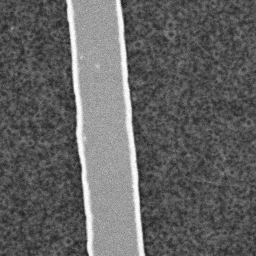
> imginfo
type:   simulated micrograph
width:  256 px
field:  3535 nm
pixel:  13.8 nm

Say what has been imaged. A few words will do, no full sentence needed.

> one or a few lines or trenches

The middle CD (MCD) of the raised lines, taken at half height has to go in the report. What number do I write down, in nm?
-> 696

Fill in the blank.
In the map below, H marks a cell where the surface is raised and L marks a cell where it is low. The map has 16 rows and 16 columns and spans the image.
LLLLHHHLLLLLLLLL
LLLLHHHHLLLLLLLL
LLLLLHHHLLLLLLLL
LLLLLHHHLLLLLLLL
LLLLLHHHLLLLLLLL
LLLLLHHHLLLLLLLL
LLLLLHHHLLLLLLLL
LLLLLHHHLLLLLLLL
LLLLLHHHLLLLLLLL
LLLLLHHHLLLLLLLL
LLLLLHHHLLLLLLLL
LLLLLHHHHLLLLLLL
LLLLLHHHHLLLLLLL
LLLLLLHHHLLLLLLL
LLLLLLHHHLLLLLLL
LLLLLLHHHLLLLLLL